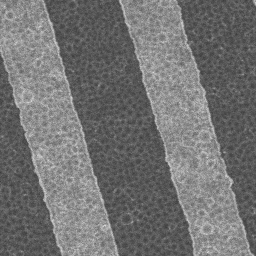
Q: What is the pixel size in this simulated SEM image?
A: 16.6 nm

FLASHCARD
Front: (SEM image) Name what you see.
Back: one or a few lines or trenches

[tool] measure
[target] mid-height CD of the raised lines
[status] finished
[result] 863 nm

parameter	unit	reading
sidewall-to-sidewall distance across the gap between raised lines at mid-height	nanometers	1240